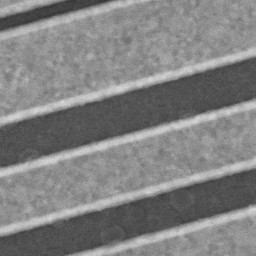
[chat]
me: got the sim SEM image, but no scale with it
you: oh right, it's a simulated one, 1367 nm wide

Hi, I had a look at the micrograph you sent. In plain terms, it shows one or a few lines or trenches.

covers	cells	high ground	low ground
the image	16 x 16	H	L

HLLLLLLHHHHHHHHH
LLLHHHHHHHHHHHHH
HHHHHHHHHHHHHHHH
HHHHHHHHHHHHHHHL
HHHHHHHHHHHLLLLL
HHHHHHHHLLLLLLLL
HHHHLLLLLLLLLLLL
LLLLLLLLLLLLHHHH
LLLLLLLLLHHHHHHH
LLLLLHHHHHHHHHHH
LHHHHHHHHHHHHHHL
HHHHHHHHHHHLLLLL
HHHHHHHLLLLLLLLL
HHHLLLLLLLLLLLLH
LLLLLLLLLLLHHHHH
LLLLLLLHHHHHHHHH